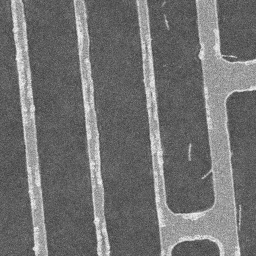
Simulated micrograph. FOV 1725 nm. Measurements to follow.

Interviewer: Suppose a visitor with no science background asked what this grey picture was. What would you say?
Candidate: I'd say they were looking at one or a few lines or trenches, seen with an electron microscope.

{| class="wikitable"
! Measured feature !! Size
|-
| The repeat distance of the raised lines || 0.42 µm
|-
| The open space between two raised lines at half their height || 350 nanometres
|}